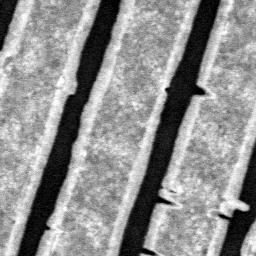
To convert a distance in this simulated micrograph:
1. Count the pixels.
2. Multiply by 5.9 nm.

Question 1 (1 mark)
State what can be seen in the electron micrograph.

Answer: one or a few lines or trenches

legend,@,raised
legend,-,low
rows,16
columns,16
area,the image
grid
-@@@@@--@@@@--@@
-@@@@---@@@@--@@
-@@@@--@@@@--@@@
@@@@@--@@@@--@@@
@@@@---@@@@--@@@
@@@@--@@@@---@@@
@@@@--@@@@--@@@@
@@@--@@@@@--@@@@
@@@--@@@@---@@@@
@@@--@@@@--@@@@-
@@--@@@@@--@@@@-
@@--@@@@---@@@@-
@@--@@@@--@@@@@-
@--@@@@@--@@@@--
@--@@@@---@@@@--
@--@@@@--@@@@--@